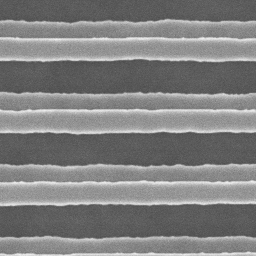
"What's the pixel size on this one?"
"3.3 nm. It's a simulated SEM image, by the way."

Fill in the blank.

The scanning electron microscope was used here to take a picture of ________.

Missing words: lines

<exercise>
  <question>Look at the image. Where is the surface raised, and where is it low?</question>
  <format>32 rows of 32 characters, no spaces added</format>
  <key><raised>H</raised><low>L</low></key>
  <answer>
LLLLLLLLLLLLLLLLLLLLLLLLLLLLLLLL
LLLLLLLLLLLLLLLLLLLLLLLLLLLLLLLL
LLLLLLLLLLLLLLLLLLLLLHLLLLLLLLLL
HHHHHHHHHHHHHHHHHHHHHHHHHHHHHHHH
HHHHHHHHHHHHHHHHHHHHHHHHHHHHHHHH
HHHHHHHHHHHHHHHHHHHHHHHHHHHHHHHH
HHHHHHHHHHHHHHHHHHHHHHHHHHHHHHHH
HHHHHHHHHHHHHHHLLLLLHHHHHHHHHHHH
LLLLLLLLLLLLLLLLLLLLLLLLLLLLLLLL
LLLLLLLLLLLLLLLLLLLLLLLLLLLLLLLL
LLLLLLLLLLLLLLLLLLLLLLLLLLLLLLLL
LLLLLLLLLLLLLLLLLLLLLLLLLLLLLLLL
HHHHHHHHHHHHHHHHHHHHHHHHHHHHHHHH
HHHHHHHHHHHHHHHHHHHHHHHHHHHHHHHH
HHHHHHHHHHHHHHHHHHHHHHHHHHHHHHHH
HHHHHHHHHHHHHHHHHHHHHHHHHHHHHHHH
HHHHHHHHHHHHHHHHHHHHLHHLHHHLLHLH
LLLLLLLLLLLLLLLLLLLLLLLLLLLLLLLL
LLLLLLLLLLLLLLLLLLLLLLLLLLLLLLLL
LLLLLLLLLLLLLLLLLLLLLLLLLLLLLLLL
LLLLLLLLLLLLLLLLLLLLLLLLLLLLLLLL
HHHHHHHHHHHHHHHHHHHHHHHHHHHHHHHH
HHHHHHHHHHHHHHHHHHHHHHHHHHHHHHHH
HHHHHHHHHHHHHHHHHHHHHHHHHHHHHHHH
HHHHHHHHHHHHHHHHHHHHHHHHHHHHHHHH
HHHHHHHHHHHLHLLHHHHHLHHLLHLLLLLL
LLLLLLLLLLLLLLLLLLLLLLLLLLLLLLLL
LLLLLLLLLLLLLLLLLLLLLLLLLLLLLLLL
LLLLLLLLLLLLLLLLLLLLLLLLLLLLLLLL
LLLLLLLLLLLLLLLLLLLLLLLLLLLLLLLL
HHHHHHHHHHHHHHHHHHHHHHHHHHHHHHHH
HHHHHHHHHHHHHHHHHHHHHHHHHHHHHHHH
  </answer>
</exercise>